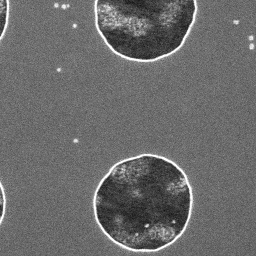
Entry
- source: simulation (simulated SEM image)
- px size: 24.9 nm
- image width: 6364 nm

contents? raised bodies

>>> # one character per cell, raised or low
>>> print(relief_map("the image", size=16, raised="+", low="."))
......++++++....
......++++++....
.......++++.....
........++......
................
................
................
................
................
................
.......++++.....
......++++++....
......++++++....
......++++++....
.......++++.....
........++......